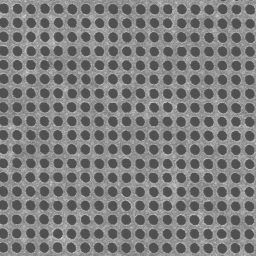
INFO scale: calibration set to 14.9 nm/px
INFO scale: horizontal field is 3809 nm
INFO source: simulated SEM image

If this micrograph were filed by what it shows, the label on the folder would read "a regular array of holes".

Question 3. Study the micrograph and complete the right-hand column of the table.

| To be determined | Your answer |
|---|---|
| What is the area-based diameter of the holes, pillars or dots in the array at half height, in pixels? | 10.1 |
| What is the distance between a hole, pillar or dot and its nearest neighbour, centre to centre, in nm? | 200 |